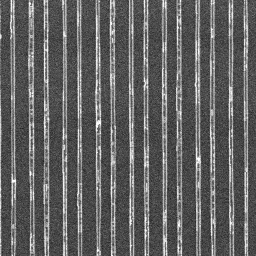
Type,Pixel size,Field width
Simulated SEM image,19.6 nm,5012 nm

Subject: parallel lines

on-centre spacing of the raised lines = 326 nm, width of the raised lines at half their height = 66.1 nanometers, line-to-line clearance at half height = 240 nanometres